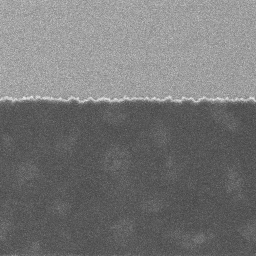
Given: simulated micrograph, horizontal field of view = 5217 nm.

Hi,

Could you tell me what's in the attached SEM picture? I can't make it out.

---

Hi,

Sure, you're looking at one or a few lines or trenches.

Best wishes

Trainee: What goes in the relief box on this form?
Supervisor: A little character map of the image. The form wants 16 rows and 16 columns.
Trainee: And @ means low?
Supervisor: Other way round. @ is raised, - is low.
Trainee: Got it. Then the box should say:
----------------
----------------
----------------
----------------
----------------
----------------
@@@@@@@@@@@@@@@@
@@@@@@@@@@@@@@@@
@@@@@@@@@@@@@@@@
@@@@@@@@@@@@@@@@
@@@@@@@@@@@@@@@@
@@@@@@@@@@@@@@@@
@@@@@@@@@@@@@@@@
@@@@@@@@@@@@@@@@
@@@@@@@@@@@@@@@@
@@@@@@@@@@@@@@@@